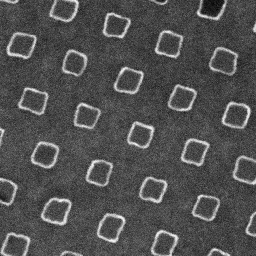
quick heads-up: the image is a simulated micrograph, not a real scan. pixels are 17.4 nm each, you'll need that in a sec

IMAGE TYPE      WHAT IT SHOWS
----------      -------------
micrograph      a regular array of raised bodies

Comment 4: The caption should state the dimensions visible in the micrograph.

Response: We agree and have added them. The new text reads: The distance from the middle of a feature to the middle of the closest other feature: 962 nanometres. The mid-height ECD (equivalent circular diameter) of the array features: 0.434 microns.